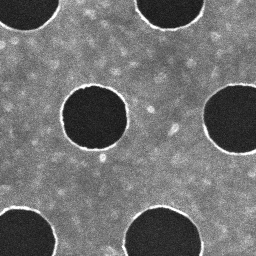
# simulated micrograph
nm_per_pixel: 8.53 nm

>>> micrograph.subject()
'holes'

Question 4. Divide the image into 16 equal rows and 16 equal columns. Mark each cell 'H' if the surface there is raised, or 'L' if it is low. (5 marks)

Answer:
LLLLHHHHHLLLLHHH
LLLHHHHHHHLLHHHH
HHHHHHHHHHHHHHHH
HHHHHHHHHHHHHHHH
HHHHHHHHHHHHHHHH
HHHHHLHHHHHHHHLL
HHHHLLLLHHHHHLLL
HHHHLLLLHHHHHLLL
HHHHLLLLHHHHHLLL
HHHHHHHHHHHHHHLH
HHHHHHHHHHHHHHHH
HHHHHHHHHHHHHHHH
HHHHHHHHHHHHHHHH
LLLHHHHHHLLLHHHH
LLLHHHHHLLLLHHHH
LLLHHHHHLLLLLHHH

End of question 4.